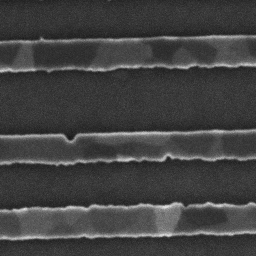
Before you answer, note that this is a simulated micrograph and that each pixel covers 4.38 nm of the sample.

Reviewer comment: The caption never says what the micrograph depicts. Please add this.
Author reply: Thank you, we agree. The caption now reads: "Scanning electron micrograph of one or a few lines or trenches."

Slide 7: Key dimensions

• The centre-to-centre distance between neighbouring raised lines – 368 nm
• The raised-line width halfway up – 0.127 micrometres